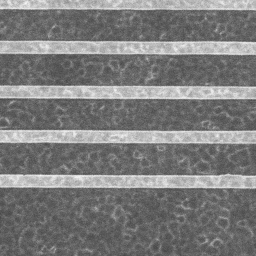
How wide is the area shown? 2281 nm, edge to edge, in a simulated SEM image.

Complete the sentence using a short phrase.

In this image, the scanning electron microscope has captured parallel lines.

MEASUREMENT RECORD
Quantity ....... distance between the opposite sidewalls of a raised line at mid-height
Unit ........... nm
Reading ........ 109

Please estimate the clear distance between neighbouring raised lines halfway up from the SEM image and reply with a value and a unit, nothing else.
290 nm